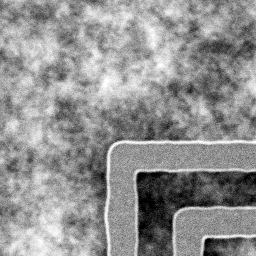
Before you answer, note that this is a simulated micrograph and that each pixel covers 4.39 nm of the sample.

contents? groups of lines, slits or small figures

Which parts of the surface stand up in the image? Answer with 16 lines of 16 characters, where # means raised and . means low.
................
................
................
................
................
................
................
................
................
.......#########
.......#########
.......#........
.......##.......
.......##..#####
.......##..#####
.......##..##...